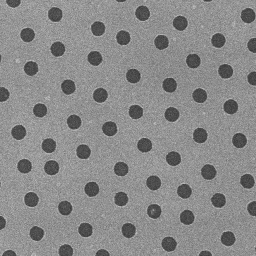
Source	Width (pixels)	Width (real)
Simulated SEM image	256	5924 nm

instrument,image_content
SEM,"a regular array of holes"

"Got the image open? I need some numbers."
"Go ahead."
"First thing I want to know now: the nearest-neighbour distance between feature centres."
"720 nm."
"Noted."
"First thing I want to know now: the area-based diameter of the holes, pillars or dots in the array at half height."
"356 nm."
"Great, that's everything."